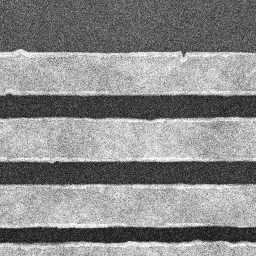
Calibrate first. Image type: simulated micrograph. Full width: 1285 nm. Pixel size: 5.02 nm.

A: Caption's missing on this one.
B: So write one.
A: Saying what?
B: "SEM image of one or a few lines or trenches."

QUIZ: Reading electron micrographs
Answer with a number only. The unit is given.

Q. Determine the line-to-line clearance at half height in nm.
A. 117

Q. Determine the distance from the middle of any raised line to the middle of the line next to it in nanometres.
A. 332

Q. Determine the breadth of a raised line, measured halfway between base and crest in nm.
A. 211